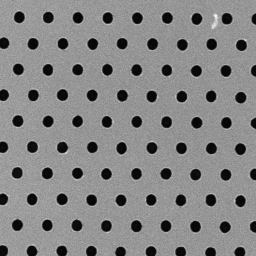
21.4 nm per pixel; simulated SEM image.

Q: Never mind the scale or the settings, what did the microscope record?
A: a regular array of holes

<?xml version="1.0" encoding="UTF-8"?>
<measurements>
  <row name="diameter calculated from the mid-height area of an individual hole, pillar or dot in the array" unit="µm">0.246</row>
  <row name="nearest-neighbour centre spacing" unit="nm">625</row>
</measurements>